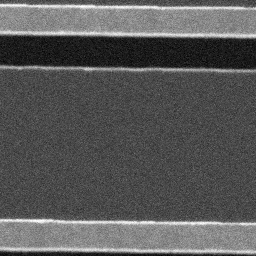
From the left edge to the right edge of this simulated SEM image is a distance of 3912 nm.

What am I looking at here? lines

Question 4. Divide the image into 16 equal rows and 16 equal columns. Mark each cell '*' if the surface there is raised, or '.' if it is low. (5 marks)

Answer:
****************
****************
................
................
****************
****************
****************
****************
****************
****************
****************
****************
****************
****************
****************
****************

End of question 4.